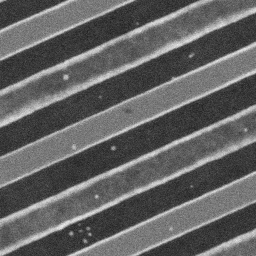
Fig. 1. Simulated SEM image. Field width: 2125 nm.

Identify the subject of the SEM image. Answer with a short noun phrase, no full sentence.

lines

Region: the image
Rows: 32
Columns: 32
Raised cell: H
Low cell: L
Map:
LLLLLLLLHHHHHHHHLLLLLLLLHHHHHHHH
LLLLLHHHHHHHHHLLLLLLLLHHHHHHHHHH
LLLHHHHHHHHLLLLLLLLLHHHHHHHHHLLL
LHHHHHHHHLLLLLLLLLHHHHHHHHHLLLLL
HHHHHHHLLLLLLLLHHHHHHHHHHLLLLLLL
HHHHHLLLLLLLLHHHHHHHHHHLLLLLLLLL
HHLLLLLLLLLHHHHHHHHHLLLLLLLLLHHH
LLLLLLLLLHHHHHHHHHLLLLLLLLLHHHHH
LLLLLLLHHHHHHHHHLLLLLLLLLHHHHHHH
LLLLHHHHHHHHHHLLLLLLLLLHHHHHHHHL
LLHHHHHHHHHHLLLLLLLLLHHHHHHHHLLL
HHHHHHHHHLLLLLLLLLHHHHHHHHHLLLLL
HHHHHHHLLLLLLLLLHHHHHHHHLLLLLLLL
HHHHLLLLLLLLLLHHHHHHHHLLLLLLLLLH
HHLLLLLLLLLLHHHHHHHHLLLLLLLLLHHH
LLLLLLLLLHHHHHHHHHLLLLLLLLLHHHHH
LLLLLLLHHHHHHHHLLLLLLLLLLHHHHHHH
LLLLLHHHHHHHHLLLLLLLLLHHHHHHHHHH
LLLHHHHHHHHLLLLLLLLLHHHHHHHHHHLL
HHHHHHHHHLLLLLLLLLHHHHHHHHHHLLLL
HHHHHHHLLLLLLLLLHHHHHHHHHLLLLLLL
HHHHLLLLLLLLLLHHHHHHHHHLLLLLLLLL
HHLLLLLLLLLHHHHHHHHHHLLLLLLLLLHH
LLLLLLLLLHHHHHHHHHHLLLLLLLLHHHHH
LLLLLLLHHHHHHHHHLLLLLLLLLHHHHHHH
LLLLLHHHHHHHHHLLLLLLLLLHHHHHHHHL
LLLHHHHHHHHHLLLLLLLLLHHHHHHHHLLL
HHHHHHHHHHLLLLLLLLLHHHHHHHHLLLLL
HHHHHHHHLLLLLLLLHHHHHHHHHLLLLLLL
HHHHHLLLLLLLLLHHHHHHHHLLLLLLLLHH
HHHLLLLLLLLLHHHHHHHHLLLLLLLLHHHH
HLLLLLLLLLHHHHHHHHLLLLLLLLHHHHHH